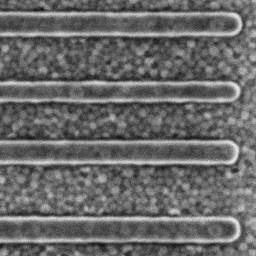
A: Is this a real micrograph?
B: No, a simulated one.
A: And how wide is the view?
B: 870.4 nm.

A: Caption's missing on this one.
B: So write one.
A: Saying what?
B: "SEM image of one or a few lines or trenches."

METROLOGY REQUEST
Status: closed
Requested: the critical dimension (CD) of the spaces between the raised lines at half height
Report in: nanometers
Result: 161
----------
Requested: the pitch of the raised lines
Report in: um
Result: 0.233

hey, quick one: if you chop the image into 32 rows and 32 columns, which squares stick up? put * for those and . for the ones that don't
................................
................................
******************************..
******************************..
................................
................................
................................
................................
................................
................................
*****************************...
******************************..
*****************************...
................................
................................
................................
................................
................................
******************************..
******************************..
....*...........................
................................
................................
................................
................................
................................
................................
*****************************...
******************************..
******************************..
................................
................................